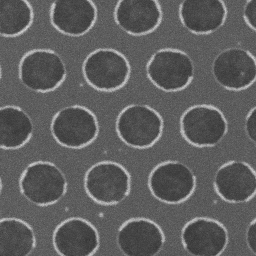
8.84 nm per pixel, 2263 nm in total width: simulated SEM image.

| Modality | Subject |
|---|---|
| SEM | a regular array of holes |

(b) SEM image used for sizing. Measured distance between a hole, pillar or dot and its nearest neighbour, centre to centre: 0.568 microns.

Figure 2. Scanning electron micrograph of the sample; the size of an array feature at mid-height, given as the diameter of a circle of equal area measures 355 nm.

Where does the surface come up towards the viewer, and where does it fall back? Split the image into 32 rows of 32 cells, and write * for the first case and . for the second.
...****....****....****.....***.
....***.....***.....***.....***.
....***.....***.....***.....***.
...****....****....*****...*****
********************************
********************************
************..*******.******...*
***.....***....****.....***.....
***.....***.....***.....***.....
***.....***.....***.....***.....
***....*****...*****...*****...*
********************************
********************************
*.**************..******..******
...****....****.....***.....***.
....***.....***.....***.....***.
....***.....***.....***.....***.
...****....*****...*****...*****
********************************
********************************
*********************.*******.**
***....****....****.....***....*
***.....***.....***.....***.....
***.....***.....***.....***.....
***.....****...*****...*****...*
********************************
********************************
********************************
....****...****.....***.....***.
....***.....***.....***.....***.
....***.....***.....***.....***.
....****...****.....****...*****